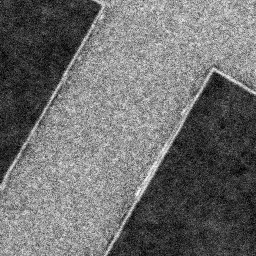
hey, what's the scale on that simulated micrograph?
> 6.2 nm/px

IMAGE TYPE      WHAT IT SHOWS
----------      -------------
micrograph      one or a few lines or trenches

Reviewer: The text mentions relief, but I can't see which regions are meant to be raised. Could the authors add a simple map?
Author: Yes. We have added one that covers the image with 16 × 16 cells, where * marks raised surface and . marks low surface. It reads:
******..........
******..........
*****...........
*****...........
****............
****.........**.
***.........****
**.........*****
**.........*****
*.........******
*.........******
.........*******
.........*******
........********
.......*********
.......*********